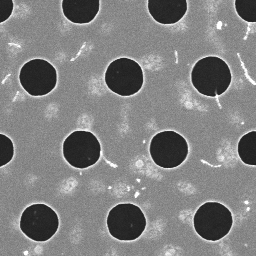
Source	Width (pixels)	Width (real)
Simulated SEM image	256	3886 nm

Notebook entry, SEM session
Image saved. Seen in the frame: a regular array of holes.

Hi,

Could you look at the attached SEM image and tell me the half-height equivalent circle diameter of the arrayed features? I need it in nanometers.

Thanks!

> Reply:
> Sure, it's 576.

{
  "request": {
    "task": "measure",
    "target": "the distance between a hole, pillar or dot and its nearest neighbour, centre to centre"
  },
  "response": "1280 nanometres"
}